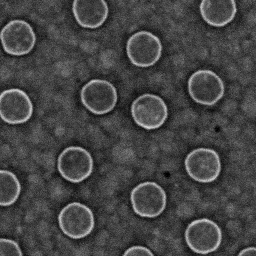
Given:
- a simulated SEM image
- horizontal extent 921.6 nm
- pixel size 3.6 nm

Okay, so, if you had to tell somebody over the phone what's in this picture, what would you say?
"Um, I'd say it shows a regular array of raised bodies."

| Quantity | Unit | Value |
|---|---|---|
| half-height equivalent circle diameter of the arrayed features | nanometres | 123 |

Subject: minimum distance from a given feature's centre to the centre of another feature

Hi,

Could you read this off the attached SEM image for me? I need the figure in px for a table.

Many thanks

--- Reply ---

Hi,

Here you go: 61.8